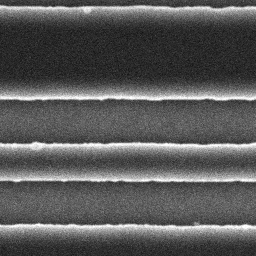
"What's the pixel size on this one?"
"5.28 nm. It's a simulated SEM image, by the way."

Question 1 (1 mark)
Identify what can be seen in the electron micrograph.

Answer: lines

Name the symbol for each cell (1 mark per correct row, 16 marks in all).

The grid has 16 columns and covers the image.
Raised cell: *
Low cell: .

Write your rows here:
***********.*..*
****************
****************
****************
****************
****************
................
................
................
****************
****************
................
................
................
****************
****************